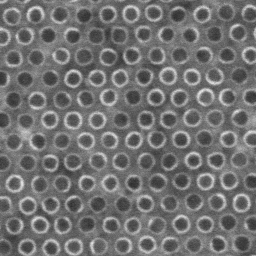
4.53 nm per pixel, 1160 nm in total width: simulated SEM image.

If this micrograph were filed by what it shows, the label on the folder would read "a regular array of raised bodies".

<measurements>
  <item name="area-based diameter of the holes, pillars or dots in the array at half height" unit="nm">76.1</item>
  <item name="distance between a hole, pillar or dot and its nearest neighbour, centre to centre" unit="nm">104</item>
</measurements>